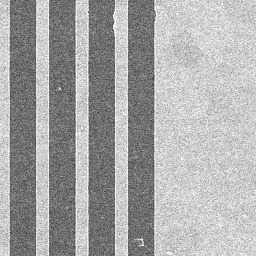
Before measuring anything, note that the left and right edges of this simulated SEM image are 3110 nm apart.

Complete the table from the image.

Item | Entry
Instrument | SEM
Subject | parallel lines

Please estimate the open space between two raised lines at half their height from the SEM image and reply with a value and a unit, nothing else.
0.33 um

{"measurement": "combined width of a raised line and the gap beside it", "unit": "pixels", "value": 39.2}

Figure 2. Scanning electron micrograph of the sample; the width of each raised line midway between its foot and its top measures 146 nanometers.